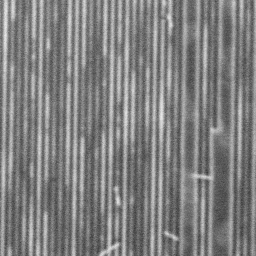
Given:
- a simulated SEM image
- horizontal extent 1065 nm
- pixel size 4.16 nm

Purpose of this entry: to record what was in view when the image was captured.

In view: parallel lines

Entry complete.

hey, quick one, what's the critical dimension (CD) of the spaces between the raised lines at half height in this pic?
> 22.9 nm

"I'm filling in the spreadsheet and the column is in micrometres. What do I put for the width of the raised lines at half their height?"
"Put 0.0042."